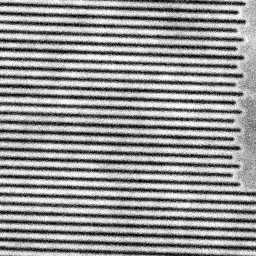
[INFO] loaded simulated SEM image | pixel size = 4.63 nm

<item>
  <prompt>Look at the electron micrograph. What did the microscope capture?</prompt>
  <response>parallel lines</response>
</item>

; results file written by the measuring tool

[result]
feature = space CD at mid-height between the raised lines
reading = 22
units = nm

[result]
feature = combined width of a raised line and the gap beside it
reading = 41.9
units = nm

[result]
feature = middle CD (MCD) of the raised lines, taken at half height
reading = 22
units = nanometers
